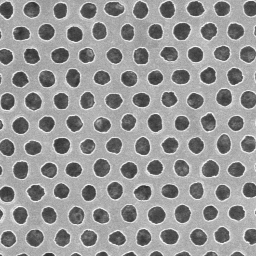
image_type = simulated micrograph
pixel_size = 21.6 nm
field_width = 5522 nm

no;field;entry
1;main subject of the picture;a regular array of holes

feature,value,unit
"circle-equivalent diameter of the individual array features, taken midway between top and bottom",348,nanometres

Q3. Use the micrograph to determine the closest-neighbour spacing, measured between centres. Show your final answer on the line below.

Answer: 25.3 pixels